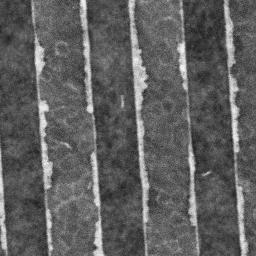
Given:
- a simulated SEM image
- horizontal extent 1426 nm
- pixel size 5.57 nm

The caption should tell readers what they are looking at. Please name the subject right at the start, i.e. one or a few lines or trenches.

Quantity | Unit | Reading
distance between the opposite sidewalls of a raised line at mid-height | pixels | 53.2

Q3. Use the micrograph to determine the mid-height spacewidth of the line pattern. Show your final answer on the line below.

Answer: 238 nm